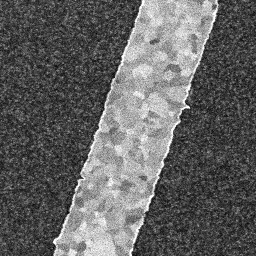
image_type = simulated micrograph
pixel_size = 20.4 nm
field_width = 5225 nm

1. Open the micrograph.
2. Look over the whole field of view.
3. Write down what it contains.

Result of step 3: one or a few lines or trenches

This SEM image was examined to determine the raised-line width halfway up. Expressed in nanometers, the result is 1480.